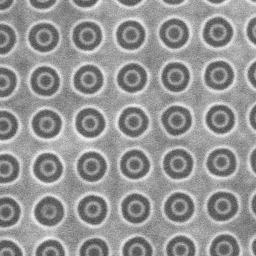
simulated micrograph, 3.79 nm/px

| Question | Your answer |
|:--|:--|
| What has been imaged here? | an array of small figures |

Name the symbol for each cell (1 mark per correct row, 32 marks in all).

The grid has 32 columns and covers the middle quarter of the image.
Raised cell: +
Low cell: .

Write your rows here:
++++....+++++++....++++++......+
+++......+++++......+++++..++..+
++...++...+++..++++..+++..++++..
++..++++..+++..++++..+++..++++..
++..++++..+++..++++..+++...++..+
++...++...++++......+++++......+
+++......++++++.....++++++....++
+++++...++++++++++++++++++++++++
++++++++++++++++++++++++++++++++
++++++++++++++++++++++++++++++++
+++++++++++++++++++++++++++...++
++++.....++++++.....+++++......+
+++.......++++.......+++...++...
+++..+++..++++..+++..+++..++++..
+++..+++..+++...+++..+++..++++..
+++..+++..+++...+++..++++..+++..
+++...+...++++.......++++......+
++++.....++++++.....++++++....++
+++++..++++++++++.++++++++++++++
++++++++++++++++++++++++++++++++
++++++++++++++++++++++++++++++++
++++++++++++++++...++++++++...++
+++++....++++++.....+++++......+
++++......++++...+...++++..+++..
+++..+++...+++..+++...+++..+++..
+++..++++..+++..+++...+++..+++..
+++..++++..+++..+++..++++..+++..
+++...+...+++++......++++.......
++++......++++++....++++++.....+
++++++..++++++++++++++++++++++++
++++++++++++++++++++++++++++++++
++++++++++++++++++++++++++++++++